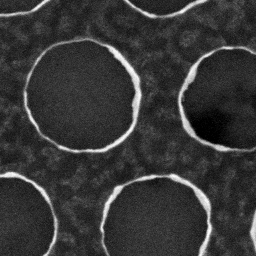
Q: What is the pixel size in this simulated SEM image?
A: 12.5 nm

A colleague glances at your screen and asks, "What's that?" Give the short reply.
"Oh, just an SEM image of holes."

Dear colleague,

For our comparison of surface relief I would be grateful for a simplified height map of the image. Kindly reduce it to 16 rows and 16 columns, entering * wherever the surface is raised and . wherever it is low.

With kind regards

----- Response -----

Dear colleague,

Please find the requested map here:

..*******...****
****************
****************
***....******...
**......****....
**.......**.....
**.......**.....
**......****....
***.....****....
****************
****************
..******....****
...****......***
...****......***
...***.......***
...****......***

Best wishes